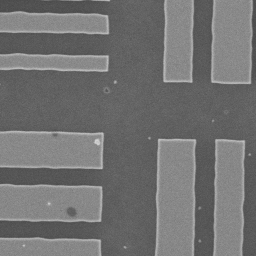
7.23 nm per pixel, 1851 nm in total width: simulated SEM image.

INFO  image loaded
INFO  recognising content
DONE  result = groups of lines, slits or small figures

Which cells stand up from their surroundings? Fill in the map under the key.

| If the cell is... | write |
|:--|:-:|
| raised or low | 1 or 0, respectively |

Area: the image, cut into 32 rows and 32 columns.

00000000000000000000011100011110
00100000000000000000011100011110
11111111111111000000011100011110
11111111111111000000011100111110
00000000000000000000011100011110
00000000000000000000011100111110
00000000000000000000111100111110
11111111111111000000111100111110
11111111111111000000111100111110
00000000000000000000111100111110
00000000000000000000000000000000
00000000000000000000000000000000
00000000000000000000000000000000
00000000000000000000000000000000
00000000000000000000000000000000
00000000000000000000000000000000
11100000000000000000000000000000
11111111111110000000111100011000
11111111111110000000111100011110
11111111111110000000111100011110
11111111111110000000111100011100
00000000000000000000111100011100
00000000000000000000111100011100
11111111111100000000111100011100
11111111111110000000111100011100
11111111111110000000111100011100
11111111111110000000111100011100
11111111111100000000111100011100
00000000000000000000111100011100
00000000000000000000111100011100
11111111111110000000111100011100
11111111111110000001111100011100